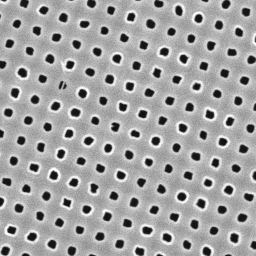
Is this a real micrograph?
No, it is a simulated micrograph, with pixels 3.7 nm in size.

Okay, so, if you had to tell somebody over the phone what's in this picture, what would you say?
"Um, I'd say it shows a regular array of holes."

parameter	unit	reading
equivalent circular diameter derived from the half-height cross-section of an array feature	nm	29.8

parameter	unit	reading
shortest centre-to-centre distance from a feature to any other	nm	77.4